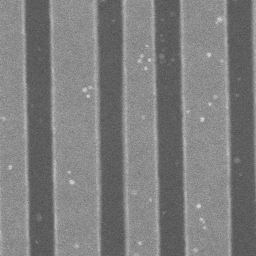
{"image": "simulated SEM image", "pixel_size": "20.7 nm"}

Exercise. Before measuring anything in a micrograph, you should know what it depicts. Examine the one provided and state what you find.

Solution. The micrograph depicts lines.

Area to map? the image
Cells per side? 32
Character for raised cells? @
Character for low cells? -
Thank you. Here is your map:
@@@---@@@@@@---@@@@----@@@@@----
@@@---@@@@@@---@@@@----@@@@@----
@@@---@@@@@@----@@@----@@@@@----
@@@---@@@@@@----@@@----@@@@@----
@@@---@@@@@@----@@@----@@@@@----
@@@----@@@@@----@@@----@@@@@----
@@@----@@@@@----@@@----@@@@@----
@@@----@@@@@----@@@----@@@@@----
@@@----@@@@@----@@@----@@@@@----
@@@----@@@@@----@@@----@@@@@----
@@@----@@@@@----@@@----@@@@@----
@@@----@@@@@----@@@----@@@@@----
@@@----@@@@@----@@@----@@@@@----
@@@----@@@@@----@@@----@@@@@----
@@@----@@@@@----@@@----@@@@@----
@@@----@@@@@----@@@----@@@@@----
@@@----@@@@@----@@@----@@@@@@---
@@@----@@@@@----@@@----@@@@@@---
@@@----@@@@@----@@@----@@@@@@---
@@@----@@@@@----@@@@---@@@@@@---
@@@----@@@@@----@@@@---@@@@@@---
@@@----@@@@@----@@@@---@@@@@@---
@@@----@@@@@----@@@@---@@@@@@---
@@@----@@@@@----@@@@---@@@@@@---
@@@----@@@@@----@@@@---@@@@@@---
@@@----@@@@@----@@@@---@@@@@@---
@@@----@@@@@----@@@@---@@@@@@---
@@@----@@@@@----@@@@---@@@@@@---
@@@----@@@@@----@@@@---@@@@@@---
@@@----@@@@@----@@@@---@@@@@@---
@@@----@@@@@----@@@@---@@@@@@---
@@@----@@@@@----@@@@---@@@@@@---